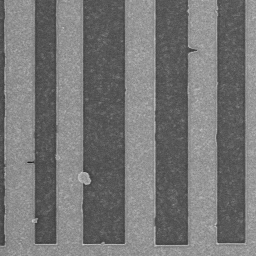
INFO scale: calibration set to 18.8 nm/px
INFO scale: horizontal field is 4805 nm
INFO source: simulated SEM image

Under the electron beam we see one or a few lines or trenches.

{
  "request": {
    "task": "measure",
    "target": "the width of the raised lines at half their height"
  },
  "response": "551 nm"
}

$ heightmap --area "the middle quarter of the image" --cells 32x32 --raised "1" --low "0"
11111000000000011111111000000001
11111000000000011111111000000001
11111000000000011111111000000001
11111000000000011111111000000001
11111000000000011111111000000001
11111000000000011111111000000001
11111000000000001111111000000001
11111000000000011111111000000001
11111000000000011111111000000001
11111000000000011111111000000001
11111000000000011111111000000001
11111000000000011111111000000001
11111000000000011111111000000001
11111000000000011111111000000001
11111000000000011111111000000001
11111000000000011111111000000001
11111000000000011111111000000001
11111000000000011111111000000001
11111000000000011111111000000001
11111000000000011111111000000001
11111000000000011111111000000001
11111000000000011111111000000001
11111000000000011111111000000001
11111000000000011111111000000001
11111000000000011111111000000001
11111000000000011111111000000001
11111000000000011111111000000001
11111100000000011111111000000001
11111100000000011111111000000001
11111110000000011111111000000001
11111000000000011111111000000001
11111000000000011111111000000001